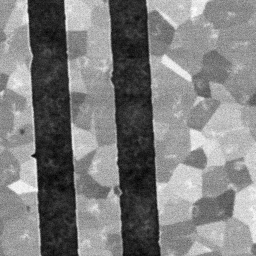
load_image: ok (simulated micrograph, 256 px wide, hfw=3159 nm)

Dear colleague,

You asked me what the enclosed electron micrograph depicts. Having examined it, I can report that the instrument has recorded one or a few lines or trenches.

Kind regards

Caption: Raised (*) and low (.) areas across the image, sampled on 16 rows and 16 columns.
**..***..*******
**..***..*******
**..***..*******
**..***..*******
**..***..*******
**..***..*******
**..***...******
**..***...******
**...**...******
**...**...******
**...**...******
**...**...******
**...**...******
**...***..******
**...***..******
**...***..******